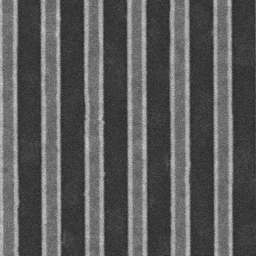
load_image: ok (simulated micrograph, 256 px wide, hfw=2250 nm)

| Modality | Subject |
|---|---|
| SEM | parallel lines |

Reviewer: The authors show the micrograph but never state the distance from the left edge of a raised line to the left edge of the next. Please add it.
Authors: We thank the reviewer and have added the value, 378 nanometers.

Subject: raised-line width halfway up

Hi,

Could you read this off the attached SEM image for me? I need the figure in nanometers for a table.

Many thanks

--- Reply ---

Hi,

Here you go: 130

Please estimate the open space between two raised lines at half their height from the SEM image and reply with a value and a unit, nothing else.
243 nm